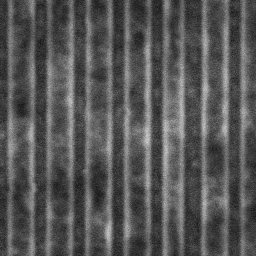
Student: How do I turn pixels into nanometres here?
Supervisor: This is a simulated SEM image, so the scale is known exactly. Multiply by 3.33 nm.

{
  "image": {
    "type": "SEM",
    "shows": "parallel lines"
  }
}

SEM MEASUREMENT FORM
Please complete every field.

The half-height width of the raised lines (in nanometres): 79.1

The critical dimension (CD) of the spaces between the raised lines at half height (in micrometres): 0.0483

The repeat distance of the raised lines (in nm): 129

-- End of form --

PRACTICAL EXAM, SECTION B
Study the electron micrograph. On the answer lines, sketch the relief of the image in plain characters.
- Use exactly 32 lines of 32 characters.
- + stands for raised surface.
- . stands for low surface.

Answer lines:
.+++..+++..+++..+++..++...++..++
.+++..+++..+++..+++..++...++..++
.+++..+++..+++..+++..++...++..++
.+++..+++..+++..+++..++...++..++
.+++..+++..+++..+++..++...++..++
.+++..+++..+++..+++..++...++..++
.+++..+++..+++..+++..++...++..++
.+++..+++..+++..+++..++...++..++
.+++..+++..+++..+++..++...++..++
.+++..+++..+++..+++..++...++..++
.+++..+++..+++..+++..++...++..++
.+++..+++..+++..+++..++...++..++
.+++..+++..+++..+++..++..+++..++
.+++..+++..+++..+++..++..+++..++
.+++..+++..+++..+++..++..+++..++
.+++..+++..+++..+++..++..+++..++
.+++..+++..+++..+++..++..+++..++
.+++..+++..+++..+++..++..+++..++
.+++..+++..+++..+++..++..+++..++
.+++..+++..+++..+++..++..+++..++
.+++..+++..+++..+++..++..+++..++
.+++..+++..+++..+++..++..+++..++
.+++..+++..+++..+++..++..+++..++
.+++..+++..+++..+++..++..+++..++
.+++..+++..+++..+++..++..+++..++
.+++..+++..+++..+++..++..+++..++
.+++..+++..+++..+++..++..+++..++
.+++..+++..+++..+++..++..+++..++
.+++..+++..+++..+++..++..+++..++
.+++..+++..+++..+++..++..+++..++
.+++..+++..+++..+++..++..+++..++
.+++..+++..+++..+++..++..+++..++